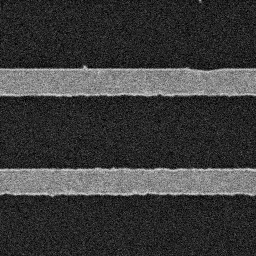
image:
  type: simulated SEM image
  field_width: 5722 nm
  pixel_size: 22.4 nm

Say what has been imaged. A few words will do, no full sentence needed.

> one or a few lines or trenches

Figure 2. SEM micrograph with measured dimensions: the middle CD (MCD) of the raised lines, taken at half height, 564 nanometers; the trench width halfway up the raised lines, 1670 nm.